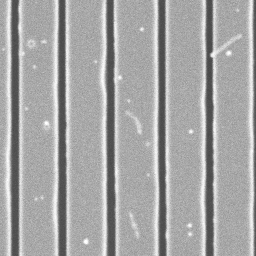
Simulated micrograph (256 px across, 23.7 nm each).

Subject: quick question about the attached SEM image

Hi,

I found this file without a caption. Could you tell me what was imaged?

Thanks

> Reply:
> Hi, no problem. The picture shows lines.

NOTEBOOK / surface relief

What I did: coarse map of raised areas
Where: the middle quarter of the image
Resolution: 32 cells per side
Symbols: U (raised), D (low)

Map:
DUUUUUUUUUDDDUUUUUUUUUUDDDUUUUUU
DUUUUUUUUUDDDUUUUUUUUUUDDDUUUUUU
DUUUUUUUUUDDDUUUUUUUUUUDDDUUUUUU
DUUUUUUUUUDDDUUUUUUUUUUUDDUUUUUU
DUUUUUUUUUDDDUUUUUUUUUUUDDUUUUUU
DUUUUUUUUUDDDUUUUUUUUUUUDDUUUUUU
DUUUUUUUUUDDDUUUUUUUUUUUDDUUUUUU
DUUUUUUUUUDDDUUUUUUUUUUUDDUUUUUU
DUUUUUUUUUDDDUUUUUUUUUUUDDUUUUUU
DUUUUUUUUUDDDUUUUUUUUUUUDDUUUUUU
DUUUUUUUUUDDDUUUUUUUUUUUDDUUUUUU
DUUUUUUUUUDDDUUUUUUUUUUUDDUUUUUU
DUUUUUUUUUDDDUUUUUUUUUUDDDUUUUUU
DUUUUUUUUUDDDUUUUUUUUUUDDDUUUUUU
DUUUUUUUUUDDDUUUUUUUUUUDDDUUUUUU
DUUUUUUUUUDDDUUUUUUUUUUDDDUUUUUU
DUUUUUUUUUDDDUUUUUUUUUUDDDUUUUUU
DUUUUUUUUUDDDUUUUUUUUUUDDDUUUUUU
DUUUUUUUUUDDDUUUUUUUUUUDDDUUUUUU
DUUUUUUUUUDDDUUUUUUUUUUDDDUUUUUU
DUUUUUUUUUDDDUUUUUUUUUUDDDUUUUUU
DUUUUUUUUUDDDUUUUUUUUUUDDDUUUUUU
DUUUUUUUUUDDDUUUUUUUUUUDDDUUUUUU
DUUUUUUUUUDDDUUUUUUUUUUDDDUUUUUU
DUUUUUUUUUUDDUUUUUUUUUUDDDUUUUUU
DUUUUUUUUUDDDUUUUUUUUUUDDDUUUUUU
DUUUUUUUUUUDDUUUUUUUUUUUDDUUUUUU
DUUUUUUUUUUDDUUUUUUUUUUUDDUUUUUU
DUUUUUUUUUUDDUUUUUUUUUUUDDUUUUUU
DUUUUUUUUUUDDUUUUUUUUUUUDDUUUUUU
DUUUUUUUUUDDDUUUUUUUUUUUDDUUUUUU
DUUUUUUUUUDDDUUUUUUUUUUUDDUUUUUU